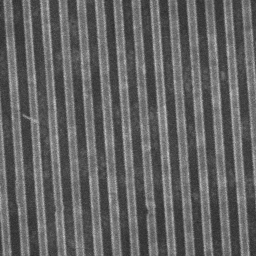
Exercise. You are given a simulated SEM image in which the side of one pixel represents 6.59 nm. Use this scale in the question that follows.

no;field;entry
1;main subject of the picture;parallel lines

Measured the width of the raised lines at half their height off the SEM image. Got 0.0444 microns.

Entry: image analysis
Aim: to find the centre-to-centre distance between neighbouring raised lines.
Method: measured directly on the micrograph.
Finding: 120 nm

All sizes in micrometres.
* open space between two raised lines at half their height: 0.0764